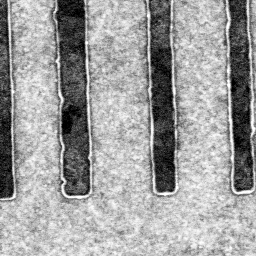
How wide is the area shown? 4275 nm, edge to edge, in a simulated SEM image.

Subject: one or a few lines or trenches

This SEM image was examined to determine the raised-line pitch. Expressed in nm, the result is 1400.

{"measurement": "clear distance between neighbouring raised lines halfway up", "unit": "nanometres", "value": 922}